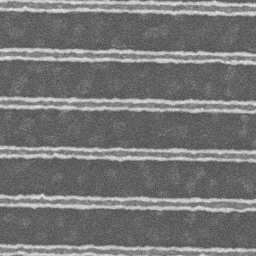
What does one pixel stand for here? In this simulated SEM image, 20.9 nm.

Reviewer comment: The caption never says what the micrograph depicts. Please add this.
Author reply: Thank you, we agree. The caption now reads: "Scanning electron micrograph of parallel lines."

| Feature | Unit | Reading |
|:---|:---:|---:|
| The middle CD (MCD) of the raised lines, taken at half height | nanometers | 195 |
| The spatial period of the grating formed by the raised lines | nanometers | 1020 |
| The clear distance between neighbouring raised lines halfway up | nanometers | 818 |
